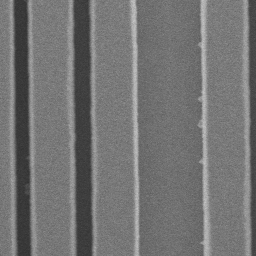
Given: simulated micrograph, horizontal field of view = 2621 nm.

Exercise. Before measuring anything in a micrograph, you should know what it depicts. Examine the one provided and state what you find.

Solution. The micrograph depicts lines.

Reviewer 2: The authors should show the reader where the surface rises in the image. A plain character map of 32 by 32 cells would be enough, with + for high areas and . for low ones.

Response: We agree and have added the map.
++.++++++..++++++........++++++.
++..+++++..++++++........++++++.
++..+++++..++++++........++++++.
++..+++++..++++++........++++++.
++..+++++..++++++........++++++.
++..+++++..++++++........++++++.
++..+++++..++++++........++++++.
++..+++++..++++++........++++++.
++..+++++..++++++........++++++.
++..+++++..++++++........++++++.
++..+++++..++++++........++++++.
++..+++++..++++++........++++++.
++..+++++..++++++........++++++.
++..+++++..++++++........++++++.
++..+++++..++++++........++++++.
++..+++++..++++++........++++++.
++..+++++..++++++........++++++.
++..+++++..++++++........++++++.
++..+++++..++++++........++++++.
++..+++++..++++++........++++++.
++..+++++..++++++........++++++.
++..+++++..++++++........++++++.
++..+++++..++++++........++++++.
++..+++++...+++++........++++++.
++..+++++...+++++.........+++++.
++..+++++...+++++.........+++++.
++..+++++...+++++.........+++++.
++..+++++...+++++.........+++++.
++..+++++...+++++.........+++++.
++..+++++...+++++.........+++++.
++..+++++...+++++.........+++++.
++..+++++...+++++.........+++++.